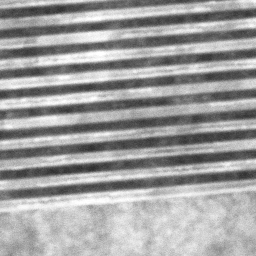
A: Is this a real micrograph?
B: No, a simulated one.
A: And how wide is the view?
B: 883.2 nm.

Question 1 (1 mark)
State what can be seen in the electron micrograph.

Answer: parallel lines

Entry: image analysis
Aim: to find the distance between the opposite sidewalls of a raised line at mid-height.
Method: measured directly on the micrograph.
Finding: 36.5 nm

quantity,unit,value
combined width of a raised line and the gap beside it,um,0.0693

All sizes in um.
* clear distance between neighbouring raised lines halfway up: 0.0335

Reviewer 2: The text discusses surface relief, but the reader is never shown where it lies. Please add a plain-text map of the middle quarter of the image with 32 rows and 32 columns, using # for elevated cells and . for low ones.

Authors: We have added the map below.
.........................#######
.............###################
.#############################..
##################..............
#######.........................
..........................######
..............##################
..#############################.
####################............
########........................
...........................#####
...............#################
...###########################..
##################.#............
######..........................
............................####
................################
....###########################.
###################.............
#######.........................
...........................#####
...............#################
...#############################
####################............
########........................
............................####
................################
....############################
#####################...........
########........................
.............................###
.................###############